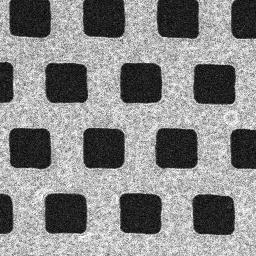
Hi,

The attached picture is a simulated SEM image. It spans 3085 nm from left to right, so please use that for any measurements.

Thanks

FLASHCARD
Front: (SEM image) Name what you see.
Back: a regular array of holes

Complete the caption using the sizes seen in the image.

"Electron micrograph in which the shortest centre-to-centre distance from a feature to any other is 0.885 um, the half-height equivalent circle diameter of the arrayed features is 0.547 um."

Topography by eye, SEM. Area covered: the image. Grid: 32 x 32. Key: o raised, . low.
o.....oooo......oooo.....oooo...
o.....oooo......oooo.....oooo...
o.....oooo......oooo.....oooo...
o.....oooo......oooo.....oooo...
oo....ooooo....ooooo.....oooo...
oooooooooooooooooooooooooooooooo
oooooooooooooooooooooooooooooooo
oooooooooooooooooooooooooooooooo
..oooo.....oooo.....oooo.....ooo
..oooo.....oooo.....oooo.....ooo
..oooo.....oooo.....oooo.....ooo
..oooo.....oooo.....oooo.....ooo
..oooo.....oooo.....oooo.....ooo
oooooooooooooooooooooooooooooooo
oooooooooooooooooooooooooooooooo
oooooooooooooooooooooooooooooooo
o.....ooooo....ooooo....ooooo...
o.....oooo......ooo......oooo...
o.....oooo......ooo......oooo...
o.....oooo......ooo......oooo...
o.....ooooo....ooooo.....oooo...
oooooooooooooooooooooooooooooooo
oooooooooooooooooooooooooooooooo
oooooooooooooooooooooooooooooooo
.ooooo....ooooo.....ooooo...oooo
..oooo.....oooo.....oooo.....ooo
..oooo.....oooo.....oooo.....ooo
..oooo.....oooo.....oooo.....ooo
..oooo.....oooo.....oooo.....ooo
oooooooooooooooooooooooooooooooo
oooooooooooooooooooooooooooooooo
oooooooooooooooooooooooooooooooo